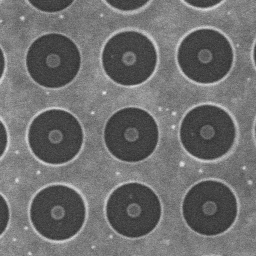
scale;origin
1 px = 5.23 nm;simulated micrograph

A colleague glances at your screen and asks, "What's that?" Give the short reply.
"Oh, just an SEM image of an array of small figures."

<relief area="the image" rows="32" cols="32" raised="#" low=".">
####.....####.....#####....#####
#####..#########################
################################
#########################.######
#####...######....#####.....####
####.....####......###.......###
###.......###.......##...#...###
.##...#...###...#...##...#...###
.##.......###......###.......###
####......####.....####.....####
#####...#######..########.######
################################
################################
################.#######....####
####.....#####.....####......###
.###......###.......###......###
.##.......###...#...##...##...##
.##...#...###...#...###.......##
.###......###......####......###
####......####.....#####....####
######..########################
################################
##########################.#####
#####....#####.....#####.....###
####......####......###......###
.###.......##.......###...#...##
.###...#...##...#...###...#...##
.###.......##.......###......###
.###......####.....#####.....###
#####....######...########.#####
################################
################################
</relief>